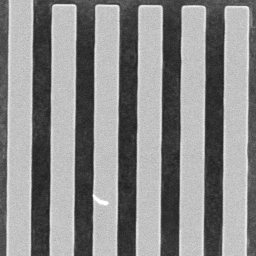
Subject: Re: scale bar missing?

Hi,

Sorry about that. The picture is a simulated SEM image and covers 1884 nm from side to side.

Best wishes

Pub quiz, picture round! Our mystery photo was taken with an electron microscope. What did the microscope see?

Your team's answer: groups of lines, slits or small figures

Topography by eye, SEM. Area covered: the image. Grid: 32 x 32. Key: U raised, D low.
DUUUDDDDDDDDDDDDDDDDDDDDDDDDDDDD
DUUUDDDUUUDDUUUDDUUUDDDUUUDDUUUD
DUUUDDUUUUDDUUUDDUUUDDDUUUDDUUUD
DUUUDDUUUUDDUUUDDUUUDDDUUUDDUUUD
DUUUDDUUUUDDUUUDDUUUDDDUUUDDUUUD
DUUUDDUUUDDDUUUDDUUUDDDUUUDDUUUD
DUUUDDUUUDDDUUUDDUUUDDDUUUDDUUUD
DUUUDDUUUDDDUUUDDUUUDDDUUUDDUUUD
DUUUDDUUUDDDUUUDDUUUDDDUUUDDUUUD
DUUUDDUUUDDDUUUDDUUUDDDUUUDDUUUD
DUUUDDUUUDDDUUUDDUUUDDDUUUDDUUUD
DUUUDDUUUDDDUUUDDUUUDDDUUUDDUUUD
DUUUDDUUUDDDUUUDDUUUDDDUUUDDUUUD
DUUUDDUUUDDDUUUDDUUUDDDUUUDDUUUD
DUUUDDUUUDDDUUUDDUUUDDDUUUDDUUUD
DUUUDDUUUDDDUUUDDUUUDDDUUUDDUUUD
DUUUDDUUUDDDUUUDDUUUDDDUUUDDUUUD
DUUUDDUUUDDDUUUDDUUUDDDUUDDDUUUD
DUUUDDUUUDDDUUUDDUUUDDDUUDDDUUUD
DUUUDDUUUDDDUUUDDUUUDDDUUDDDUUUD
DUUUDDUUUDDDUUUDDUUUDDDUUDDDUUUD
DUUUDDUUUDDDUUUDDUUUDDDUUDDDUUUD
DUUUDDUUUDDDUUUDDUUUDDDUUDDDUUUD
DUUUDDUUUDDDUUUDDUUUDDDUUDDDUUUD
DUUUDDUUUDDDUUUDDUUUDDDUUDDDUUUD
DUUUDDUUUDDDUUUDDUUUDDDUUDDDUUUD
DUUUDDUUUDDDUUUDDUUUDDDUUDDDUUUD
DUUUDDUUUDDDUUUDDUUUDDDUUDDDUUUD
DUUUDDUUUDDDUUUDDUUUDDDUUDDDUUUD
DUUUDDUUUDDDUUUDDUUUDDDUUDDDUUUD
DUUUDDUUUDDDUUUDDUUUDDDUUDDDUUUD
DUUUDDUUUDDDUUUDDUUUDDDUUDDDUUUD